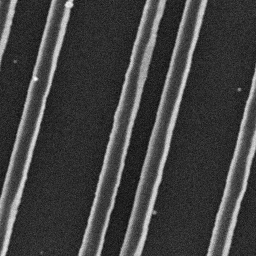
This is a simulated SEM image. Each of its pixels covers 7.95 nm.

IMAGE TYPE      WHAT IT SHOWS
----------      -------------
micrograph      lines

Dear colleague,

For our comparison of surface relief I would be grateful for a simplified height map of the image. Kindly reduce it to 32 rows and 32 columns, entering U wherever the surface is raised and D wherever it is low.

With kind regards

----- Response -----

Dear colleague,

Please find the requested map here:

UUDDDDUUUDDDDDDDDDUUDDDUUUDDDDDD
UDDDDDUUUDDDDDDDDDUUDDDUUDDDDDDD
UDDDDDUUDDDDDDDDDDUUDDDUUDDDDDDD
UDDDDDUUDDDDDDDDDUUUDDUUUDDDDDDD
UDDDDUUUDDDDDDDDDUUDDDUUUDDDDDDD
DDDDDUUUDDDDDDDDDUUDDDUUDDDDDDDD
DDDDDUUDDDDDDDDDDUUDDDUUDDDDDDDD
DDDDDUUDDDDDDDDDUUDDDUUUDDDDDDDD
DDDDUUUDDDDDDDDDUUDDDUUUDDDDDDDD
DDDDUUDDDDDDDDDDUUDDDUUDDDDDDDDD
DDDDUUDDDDDDDDDDUUDDDUUDDDDDDDDD
DDDDUUDDDDDDDDDUUUDDUUUDDDDDDDDU
DDDUUUDDDDDDDDDUUDDDUUDDDDDDDDDU
DDDUUDDDDDDDDDDUUDDDUUDDDDDDDDDU
DDDUUDDDDDDDDDUUUDDDUUDDDDDDDDDU
DDDUUDDDDDDDDDUUDDDUUUDDDDDDDDUU
DDUUUDDDDDDDDDUUDDDUUDDDDDDDDDUU
DDUUDDDDDDDDDDUUDDDUUDDDDDDDDDUU
DDUUDDDDDDDDDUUUDDDUUDDDDDDDDDUU
DUUUDDDDDDDDDUUUDDUUUDDDDDDDDUUD
DUUUDDDDDDDDDUUDDDUUDDDDDDDDDUUD
DUUDDDDDDDDDDUUDDDUUDDDDDDDDDUUD
DUUDDDDDDDDDUUUDDDUUDDDDDDDDUUUD
UUUDDDDDDDDDUUUDDUUUDDDDDDDDUUUD
UUDDDDDDDDDDUUDDDUUDDDDDDDDDUUDD
UUDDDDDDDDDDUUDDDUUDDDDDDDDDUUDD
UUDDDDDDDDDUUUDDDUUDDDDDDDDUUUDD
UUDDDDDDDDDUUUDDUUUDDDDDDDDUUDDD
UDDDDDDDDDDUUDDDUUDDDDDDDDDUUDDD
UDDDDDDDDDDUUDDDUUDDDDDDDDDUUDDD
UDDDDDDDDDUUUDDDUUDDDDDDDDUUUDDD
UDDDDDDDDDUUDDDUUDDDDDDDDDUUDDDD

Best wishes